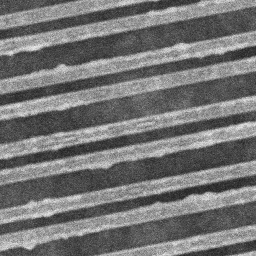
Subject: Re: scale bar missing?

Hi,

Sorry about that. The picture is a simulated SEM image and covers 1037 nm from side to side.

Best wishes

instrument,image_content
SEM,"parallel lines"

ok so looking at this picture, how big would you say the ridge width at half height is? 52.7 nm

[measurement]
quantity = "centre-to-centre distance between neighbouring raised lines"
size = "0.128 µm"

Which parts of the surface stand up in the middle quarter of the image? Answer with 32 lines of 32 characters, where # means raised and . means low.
#..#################............
##############..................
########...................#####
###...................##########
.................###############
............###############.....
.......###############..........
.################...............
###########.....................
#######.........................
###.............................
...............................#
.........................#######
....................############
................##############..
..........###############.......
.....###############............
################................
##########.................#####
######................##########
#.................##############
.............################...
........##################......
.###################............
#############...................
############....................
####............................
................................
...........................#####
....................############
...............#################
..........##################....